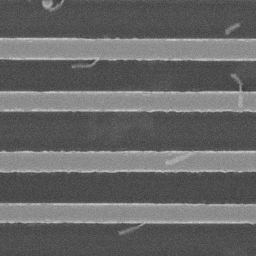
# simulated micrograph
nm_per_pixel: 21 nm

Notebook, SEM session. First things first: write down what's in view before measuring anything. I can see lines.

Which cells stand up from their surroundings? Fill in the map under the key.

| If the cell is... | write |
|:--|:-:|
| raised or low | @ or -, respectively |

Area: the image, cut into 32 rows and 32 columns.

--------------------------------
--------------------------------
--------------------------------
--------------------------------
--------------------------------
@@@@@@@@@@@@@@@@@@@@@@@@@@@@@@@@
@@@@@@@@@@@@@@@@@@@@@@@@@@@@@@@@
-----------@@-------------------
--------------------------------
--------------------------------
--------------------------------
------------------------------@-
@@@@@@@@@@@@@@@@@@@@@@@@@@@@@@@@
@@@@@@@@@@@@@@@@@@@@@@@@@@@@@@@@
--------------------------------
--------------------------------
--------------------------------
--------------------------------
--------------------------------
@@@@@@@@@@@@@@@@@@@@@@@@@@@@@@@@
@@@@@@@@@@@@@@@@@@@@@@@@@@@@@@@@
--------------------------------
--------------------------------
--------------------------------
--------------------------------
--------------------------------
@@@@@@@@@@@@@@@@@@@@@@@@@@@@@@@@
@@@@@@@@@@@@@@@@@@@@@@@@@@@@@@@@
--------------------------------
--------------------------------
--------------------------------
--------------------------------